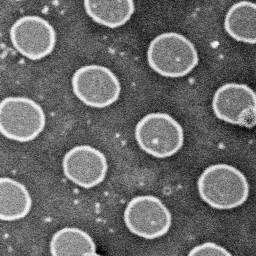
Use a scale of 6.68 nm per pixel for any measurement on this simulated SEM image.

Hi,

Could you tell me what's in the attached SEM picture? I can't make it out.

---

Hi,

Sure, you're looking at raised bodies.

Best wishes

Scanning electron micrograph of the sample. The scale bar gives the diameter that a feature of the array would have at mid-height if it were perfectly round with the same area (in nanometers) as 276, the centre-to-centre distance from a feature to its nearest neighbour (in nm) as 538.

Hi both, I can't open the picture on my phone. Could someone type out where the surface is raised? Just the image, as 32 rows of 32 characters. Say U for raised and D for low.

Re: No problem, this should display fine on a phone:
DDDDDDDDDDDUUUUUDDDDDDDDDDDDDDUD
DDDDDDDDDDDUUUUUDDDDDDDDDDDDDUUU
DDDUUDDDDDDDUUUUDDDDDDDDDDDDUUUU
DDUUUUDDDDDDDDDDDDDDDDDDDDDDUUUU
DDUUUUUDDDDDDDDDDDDDUUDDDDDDDUUU
DDUUUUUDDDDDDDDDDDDUUUUUDDDDDDDD
DDDUUUDDDDDDDDDDDDDUUUUUDDDDDDDD
DDDDDDDDDDDDDDDDDDDUUUUUDDDDDDDD
DDDDDDDDDDDUUDDDDDDUUUUUDDDDDDDD
DDDDDDDDDUUUUUDDDDDDDDDDDDDDDDDD
DDDDDDDDDUUUUUUDDDDDDDDDDDDDDDDD
DDDDDDDDDDUUUUUDDDDDDDDDDDDUUUUU
DUUDDDDDDDUUUUDDDDDDDDDDDDDUUUUU
UUUUUDDDDDDDDDDDDDDDDDDDDDDUUUUU
UUUUUDDDDDDDDDDDDDDUDDDDDDDUUUUU
UUUUUDDDDDDDDDDDDDUUUUDDDDDDDDUU
UUUUUDDDDDDDDDDDDUUUUUUDDDDDDDDD
DDDDDDDDDDDDDDDDDUUUUUUDDDDDDDDD
DDDDDDDDDDUDDDDDDDUUUUDDDDDDDDDD
DDDDDDDDUUUUUDDDDDDDDDDDDDDDDDDD
DDDDDDDDUUUUUDDDDDDDDDDDDDDDDDDD
DDDDDDDDUUUUUDDDDDDDDDDDDDUUUUDD
UDDDDDDDDUUUDDDDDDDDDDDDDUUUUUDD
UUUDDDDDDDDDDDDDDDDDDDDDDUUUUUUD
UUUDDDDDDDDDDDDDDDDDDDDDDUUUUUUD
UUUUDDDDDDDDDDDDUUUUDDDDDDUUUUDD
UUUDDDDDDDDDDDDDUUUUUDDDDDDDDDDD
DDDDDDDDDDDDDDDDUUUUUDDDDDDDDDDD
DDDDDDDDDDDDDDDDUUUUUDDDDDDDDDDD
DDDDDDDUUUUDDDDDDDUDDDDDDDDDDDDD
DDDDDDDUUUUUDDDDDDDDDDDDDDDDDDDD
DDDDDDDUUUUUDDDDDDDDDDDDUUUUDDDD